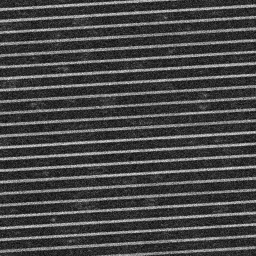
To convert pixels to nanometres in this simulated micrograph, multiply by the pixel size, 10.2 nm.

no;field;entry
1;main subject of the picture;parallel lines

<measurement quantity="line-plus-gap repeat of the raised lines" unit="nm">117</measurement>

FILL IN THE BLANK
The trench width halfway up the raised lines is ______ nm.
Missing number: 96.5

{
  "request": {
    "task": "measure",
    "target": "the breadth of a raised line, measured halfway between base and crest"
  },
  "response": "19 nanometers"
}